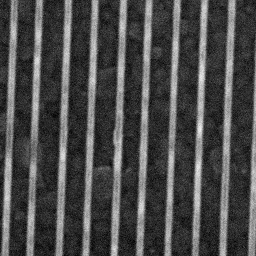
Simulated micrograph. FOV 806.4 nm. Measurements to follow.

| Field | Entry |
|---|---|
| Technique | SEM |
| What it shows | parallel lines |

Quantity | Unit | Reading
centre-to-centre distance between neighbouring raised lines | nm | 85.6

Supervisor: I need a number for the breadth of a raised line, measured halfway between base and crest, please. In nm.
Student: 18.9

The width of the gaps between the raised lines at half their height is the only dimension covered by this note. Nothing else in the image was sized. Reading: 68.4 nanometres